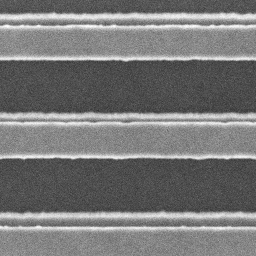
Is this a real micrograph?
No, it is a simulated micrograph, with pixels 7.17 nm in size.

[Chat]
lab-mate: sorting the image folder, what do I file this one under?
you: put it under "lines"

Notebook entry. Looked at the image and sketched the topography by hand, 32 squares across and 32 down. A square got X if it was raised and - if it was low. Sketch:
--------------------------------
--------------------------------
XXXXXXXXXXXXXXXXXXXXXXXXXXXXXXXX
XXXXXXXXXXXXXXXXXXXXXXXXXXXXXXXX
XXXXXXXXXXXXXXXXXXXXXXXXXXXXXXXX
XXXXXXXXXXXXXXXXXXXXXXXXXXXXXXXX
XXXXXXXXXXXXXXXXXXXXXXXXXXXXXXXX
---------------X----------------
--------------------------------
--------------------------------
--------------------------------
--------------------------------
--------------------------------
--------------------------------
X-XXX-X----X--------------------
XXXXXXXXXXXXXXXXXXXXXXXXXXXXXXXX
XXXXXXXXXXXXXXXXXXXXXXXXXXXXXXXX
XXXXXXXXXXXXXXXXXXXXXXXXXXXXXXXX
XXXXXXXXXXXXXXXXXXXXXXXXXXXXXXXX
XXXXXXXXXXXXXXXXXXXXXXXXXXXXXXXX
--------------------------------
--------------------------------
--------------------------------
--------------------------------
--------------------------------
--------------------------------
--------------------------------
XXXXXXXXXXXXXXXXXXXXXXXXXXXXXXXX
XXXXXXXXXXXXXXXXXXXXXXXXXXXXXXXX
XXXXXXXXXXXXXXXXXXXXXXXXXXXXXXXX
XXXXXXXXXXXXXXXXXXXXXXXXXXXXXXXX
XXXXXXXXXXXXXXXXXXXXXXXXXXXXXXXX